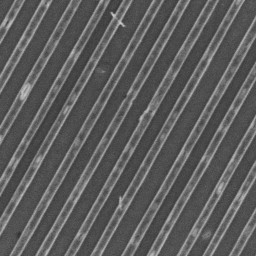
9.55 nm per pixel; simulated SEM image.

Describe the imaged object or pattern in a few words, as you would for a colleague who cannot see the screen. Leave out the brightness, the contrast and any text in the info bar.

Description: parallel lines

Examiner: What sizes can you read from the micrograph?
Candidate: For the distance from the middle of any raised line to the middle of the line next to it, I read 230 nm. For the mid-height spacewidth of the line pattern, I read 15.4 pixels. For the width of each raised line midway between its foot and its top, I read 78.1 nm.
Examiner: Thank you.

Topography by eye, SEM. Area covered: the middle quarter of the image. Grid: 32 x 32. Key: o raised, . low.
oo....oo.....ooo....oo.....oo...
o....oo......oo....ooo....ooo...
o...ooo.....oo.....oo.....oo....
o...oo......oo....ooo....ooo....
...ooo.....oo.....oo.....oo....o
...oo......oo....oo.....oo....oo
..oo......oo....ooo....ooo....oo
..oo.....ooo....oo.....oo....ooo
.oo......oo....ooo....ooo....oo.
ooo.....ooo....oo.....oo....ooo.
oo.....ooo....ooo....ooo....oo..
oo.....ooo....oo.....oo....ooo..
o.....ooo....ooo....ooo....oo...
......oo....ooo....ooo....oo....
.....ooo....oo.....oo....ooo....
.....oo....ooo....ooo....oo.....
....ooo....oo.....oo....ooo.....
...ooo....ooo....ooo....oo......
...ooo....oo.....oo....ooo.....o
..ooo....ooo....ooo....oo......o
..oo.....oo.....oo....ooo.....oo
.ooo....oo.....oo....ooo......oo
.oo....ooo....ooo....oo......oo.
ooo....oo.....oo....ooo.....ooo.
oo....ooo....ooo....oo......oo..
o.....oo.....oo....ooo.....ooo..
o....ooo....ooo....oo......oo...
.....oo.....oo....ooo.....oo....
....ooo....ooo....oo......oo....
...ooo....ooo....oo......oo....o
...oo.....oo....ooo.....ooo....o
..ooo....ooo....oo......oo....oo